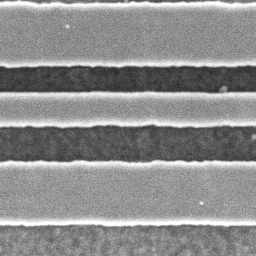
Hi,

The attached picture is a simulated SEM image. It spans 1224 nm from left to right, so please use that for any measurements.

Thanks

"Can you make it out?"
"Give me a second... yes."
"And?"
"lines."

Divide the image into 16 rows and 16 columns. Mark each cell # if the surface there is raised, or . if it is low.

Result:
################
################
################
################
................
................
################
################
................
................
################
################
################
################
................
................